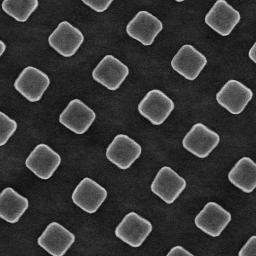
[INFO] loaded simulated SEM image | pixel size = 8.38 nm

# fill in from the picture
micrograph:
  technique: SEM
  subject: a regular array of raised bodies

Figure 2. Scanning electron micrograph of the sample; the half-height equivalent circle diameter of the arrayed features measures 263 nanometres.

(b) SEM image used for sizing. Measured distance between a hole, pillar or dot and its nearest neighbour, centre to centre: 465 nanometres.